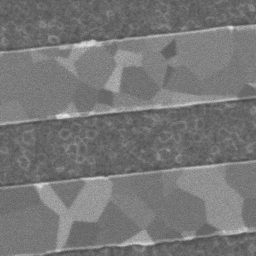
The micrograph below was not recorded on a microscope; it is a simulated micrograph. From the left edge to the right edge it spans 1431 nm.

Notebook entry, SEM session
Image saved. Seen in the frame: one or a few lines or trenches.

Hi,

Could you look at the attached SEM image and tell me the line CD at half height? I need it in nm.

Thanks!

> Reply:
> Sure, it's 394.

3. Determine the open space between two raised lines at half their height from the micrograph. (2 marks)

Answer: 357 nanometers